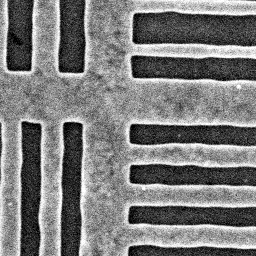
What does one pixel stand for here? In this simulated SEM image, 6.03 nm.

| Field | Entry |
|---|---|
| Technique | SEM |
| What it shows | groups of lines, slits or small figures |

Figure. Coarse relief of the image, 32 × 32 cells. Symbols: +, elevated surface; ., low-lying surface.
+...+++....+++++++++++++++++++++
+...+++....++++++......+++++++++
+...+++....+++++................
+...+++....+++++................
+...+++....+++++................
+...+++....++++++...............
+...+++....+++++++++++++++++++++
+...+++....+++++................
+...+++....+++++................
+++++++++++++++++...............
++++++++++++++++++++++++++++++++
++++++++++++++++++++++++++++++++
++++++++++++++++++++++++++++++++
++++++++++++++++++++++++++++++++
++++++++++++++++++++++++++++++++
+++..+++..+++++++.....++++++++++
+++..+++..++++++................
+++..+++..++++++................
+++..+++..++++++++++++++++++++++
+++..+++..++++++++++++++++++++++
+++..+++..+++++++++.++++++++++++
+++..+++..++++++................
++...+++..++++++................
+++..+++..++++++++++++++++++++++
+++..+++..++++++++++++++++++++++
++...+++..++++++++++++++++++++++
++...+++..++++++................
+++..++...++++++................
+++..++...++++++++++++++++++++++
++...++...++++++++++++++++++++++
++...++...++++++++++++++++++++++
++...++...++++++................